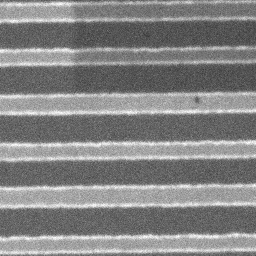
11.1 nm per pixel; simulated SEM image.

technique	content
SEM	lines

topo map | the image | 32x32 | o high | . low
oo.ooooooooooooooooooooooooooooo
oooooooooooooooooooooooooooooooo
oooooooooooo.oooo.o.............
................................
................................
................................
oooooooooooooooooooooooooooooooo
oooooooooooooooooooooooooooooooo
................................
................................
................................
................................
oooooooooooooooooooooooooooooooo
oooooooooooooooooooooooooooooooo
................................
................................
................................
................................
oooooooooooooooooooooooooooooooo
oooooooooooooooooooooooooooooooo
................................
................................
................................
.......ooooooooooooooooooooooooo
oooooooooooooooooooooooooooooooo
ooooooooooooooooooooooooooo.oo.o
................................
................................
................................
...............o..o...oooooooooo
oooooooooooooooooooooooooooooooo
oooooooooooo....................